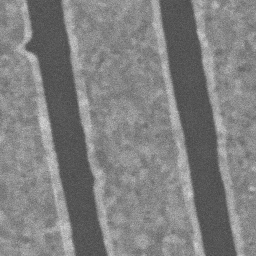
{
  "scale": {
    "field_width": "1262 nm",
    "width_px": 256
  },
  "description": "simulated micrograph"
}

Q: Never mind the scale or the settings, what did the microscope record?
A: one or a few lines or trenches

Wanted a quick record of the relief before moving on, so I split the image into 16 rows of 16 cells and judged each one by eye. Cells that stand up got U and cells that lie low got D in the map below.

UUDDUUUUUUDDUUUU
UUDDUUUUUUDDDUUU
UUDDUUUUUUDDDUUU
UUDDDUUUUUDDDUUU
UUDDDUUUUUDDDUUU
UUDDDUUUUUUDDUUU
UUUDDUUUUUUDDUUU
UUUDDUUUUUUDDDUU
UUUDDUUUUUUDDDUU
UUUDDDUUUUUDDDUU
UUUDDDUUUUUUDDUU
UUUUDDUUUUUUDDUU
UUUUDDUUUUUUDDUU
UUUUDDUUUUUUDDDU
UUUUDDDUUUUUDDDU
UUUUDDDUUUUUUDDU